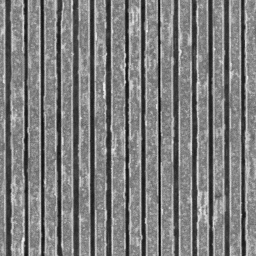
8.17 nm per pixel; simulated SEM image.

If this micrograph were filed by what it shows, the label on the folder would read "parallel lines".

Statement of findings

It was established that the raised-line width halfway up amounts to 104 nm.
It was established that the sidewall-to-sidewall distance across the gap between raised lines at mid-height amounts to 37.8 nanometers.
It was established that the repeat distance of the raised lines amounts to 137 nm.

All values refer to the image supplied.